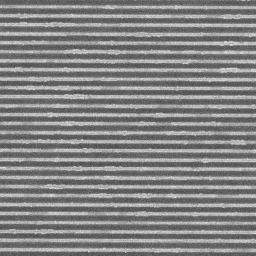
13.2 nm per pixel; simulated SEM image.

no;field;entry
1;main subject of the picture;parallel lines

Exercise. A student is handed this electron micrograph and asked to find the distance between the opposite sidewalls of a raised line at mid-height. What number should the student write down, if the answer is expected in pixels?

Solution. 3.87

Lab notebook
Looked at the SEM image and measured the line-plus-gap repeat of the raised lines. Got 119 nm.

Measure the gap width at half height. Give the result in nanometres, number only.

76.1